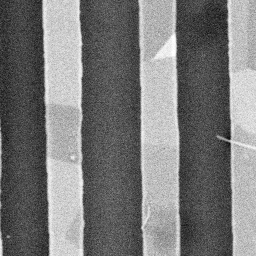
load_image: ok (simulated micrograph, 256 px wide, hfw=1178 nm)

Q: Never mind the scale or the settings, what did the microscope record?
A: lines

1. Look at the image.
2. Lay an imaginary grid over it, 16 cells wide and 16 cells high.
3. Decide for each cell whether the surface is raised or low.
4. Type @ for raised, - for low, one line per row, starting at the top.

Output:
---@@----@@---@@
---@@----@@---@@
---@@----@@---@@
---@@----@@---@@
---@@----@@---@@
---@@----@@---@@
---@@----@@---@@
---@@----@@---@@
---@@----@@---@@
---@@----@@---@@
---@@----@@---@@
---@@----@@---@@
---@@----@@----@
---@@----@@----@
---@@----@@----@
---@@----@@----@